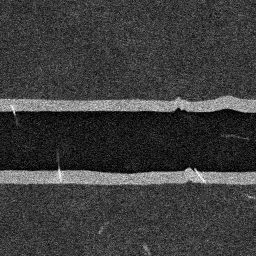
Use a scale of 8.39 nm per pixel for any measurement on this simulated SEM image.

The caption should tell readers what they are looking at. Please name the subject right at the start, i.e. one or a few lines or trenches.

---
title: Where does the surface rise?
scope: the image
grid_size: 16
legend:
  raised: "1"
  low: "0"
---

1111111111111111
1111111111111111
1111111111111111
1111111111111111
1111111111111111
1111111111111111
1001111111111101
0000000000000000
0000000000000000
0000000000000000
0000000000000000
1111111111111111
1111111111111111
1111111111111111
1111111111111111
1111111111111111